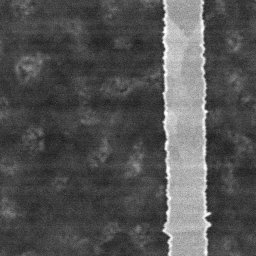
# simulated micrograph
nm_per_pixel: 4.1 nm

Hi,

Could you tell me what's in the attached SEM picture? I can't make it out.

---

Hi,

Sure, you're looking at one or a few lines or trenches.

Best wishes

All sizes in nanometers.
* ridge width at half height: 159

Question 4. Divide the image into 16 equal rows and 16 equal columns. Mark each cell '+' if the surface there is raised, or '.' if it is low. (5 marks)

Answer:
..........+++...
..........+++...
..........+++...
..........+++...
..........+++...
..........+++...
..........+++...
..........+++...
..........+++...
..........+++...
..........+++...
..........+++...
..........+++...
..........+++...
..........+++...
...........++...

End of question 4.